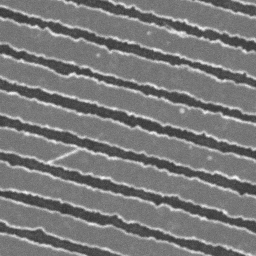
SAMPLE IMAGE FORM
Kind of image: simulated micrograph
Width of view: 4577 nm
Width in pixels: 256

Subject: parallel lines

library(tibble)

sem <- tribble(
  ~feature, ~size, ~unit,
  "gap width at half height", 0.181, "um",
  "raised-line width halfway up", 437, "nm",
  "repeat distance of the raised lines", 615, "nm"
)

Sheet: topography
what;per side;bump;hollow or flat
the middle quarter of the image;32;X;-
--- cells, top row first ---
----XXXXXXXXXXXXXXXXXXXXXXXX-XX-
-------XXXXXXXXXXXXXXXXXXXXXXXXX
--X------XXXXXXXXXXXXXXXXXXXXXXX
XXXXXXX------XXXXXXXXXXXXXXXXXXX
XXXXXXXXXX--------XXXXXXXXXXXXXX
XXXXXXXXXXXXX---------XXXXXXXXXX
XXXXXXXXXXXXXXXXX--------XXXXXXX
XXXXXXXXXXXXXXXXXXXX-----------X
--XXXXXXXXXXXXXXXXXXXXX-X-------
------XXXXXXXXXXXXXXXXXXXX------
----------XXXXXXXXXXXXXXXXXXXXX-
X------------XXXXXXXXXXXXXXXXXXX
XXXXX-----------XXXXXXXXXXXXXXXX
XXXXXXXXX-----------XXXXXXXXXXXX
XXXXXXXXXXXXX----------XXXXXXXXX
XXXXXXXXXXXXXXXX-----------XXXXX
XXXXXXXXXXXXXXXXXXXX-----------X
--XXXXXXXXXXXXXXXXXXXXXX--------
----XXXXXXXXXXXXXXXXXXXXXXXX----
---------XXXXXXXXXXXXXXXXXXXXXX-
XXX----------XXXXXXXXXXXXXXXXXXX
XXXXXX---------XXXXXXXXXXXXXXXXX
XXXXXXXXXX----------XXXXXXXXXXXX
XXXXXXXXXXXXXX----------XXXXXXXX
XXXXXXXXXXXXXXXXXX---------XXXXX
XXXXXXXXXXXXXXXXXXXXXX--------XX
--XXXXXXXXXXXXXXXXXXXXXXXX------
----XXXXXXXXXXXXXXXXXXXXXXXX----
---------XXXXXXXXXXXXXXXXXXXXXX-
XX----------XXXXXXXXXXXXXXXXXXXX
XXXXXX----------XXXXXXXXXXXXXXXX
XXXXXXXXX-----------XXXXXXXXXXXX